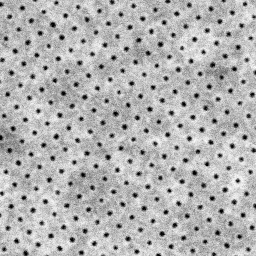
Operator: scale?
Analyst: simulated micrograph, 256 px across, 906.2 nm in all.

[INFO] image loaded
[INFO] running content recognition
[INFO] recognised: a regular array of holes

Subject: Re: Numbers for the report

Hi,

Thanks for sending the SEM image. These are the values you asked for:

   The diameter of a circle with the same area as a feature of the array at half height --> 0.0229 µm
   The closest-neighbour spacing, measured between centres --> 15.2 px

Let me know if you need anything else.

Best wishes